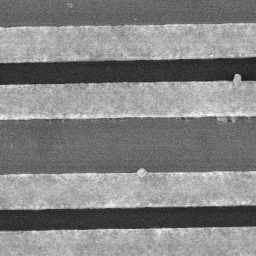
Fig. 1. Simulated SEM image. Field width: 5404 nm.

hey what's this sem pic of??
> lines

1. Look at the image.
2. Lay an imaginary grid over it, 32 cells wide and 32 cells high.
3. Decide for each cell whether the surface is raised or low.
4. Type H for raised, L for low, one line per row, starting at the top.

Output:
LLLLLLLLLLLLLLLLLLLLLLLLLLLLLLLL
LLLLLLLLLLLLLLLLLLLLLLLLLLLLLLLL
LLLLLLLLLLLLLLLLLLLLLLLLLLLLLLLL
LLHHHHHHHHHHHHHHHHHHHHHHHHHHHHHH
HHHHHHHHHHHHHHHHHHHHHHHHHHHHHHHH
HHHHHHHHHHHHHHHHHHHHHHHHHHHHHHHH
HHHHHHHHHHHHHHHHHHHHHHHHHHHHHHHH
HHHHHHHHHHHHHHHHHLLLLLLLLLLLLLLL
LLLLLLLLLLLLLLLLLLLLLLLLLLLLLLLL
LLLLLLLLLLLLLLLLLLLLLLLLLLLLLHLL
LLLLLLLLHHHHHHHHHHHHHHHHHHHHHHHH
HHHHHHHHHHHHHHHHHHHHHHHHHHHHHHHH
HHHHHHHHHHHHHHHHHHHHHHHHHHHHHHHH
HHHHHHHHHHHHHHHHHHHHHHHHHHHHHHHH
HHHHHHHHHHHHHHHHHHHHHHHHHLLLLLLL
LLLLLLLLLLLLLLLLLLLLLLLLLLLLLLLL
LLLLLLLLLLLLLLLLLLLLLLLLLLLLLLLL
LLLLLLLLLLLLLLLLLLLLLLLLLLLLLLLL
LLLLLLLLLLLLLLLLLLLLLLLLLLLLLLLL
LLLLLLLLLLLLLLLLLLLLLLLLLLLLLLLL
LLLLLLLLLLLLLLLLLLLLLLLLLLLLLLLL
LLLLLLLLLLLLLLLLLHHLLLLLLLLLLLLL
HHHHHHHHHHHHHHHHHHHHHHHHHHHHHHHH
HHHHHHHHHHHHHHHHHHHHHHHHHHHHHHHH
HHHHHHHHHHHHHHHHHHHHHHHHHHHHHHHH
HHHHHHHHHHHHHHHHHHHHHHHHHHHHHHHH
LLLLLLLLLLLLLLLLLLLLLLLLLLLLLLLL
LLLLLLLLLLLLLLLLLLLLLLLLLLLLLLLL
LLLLLLLLLLLLLLLLLLLLLLLLHHHHHHHH
HHHHHHHHHHHHHHHHHHHHHHHHHHHHHHHH
HHHHHHHHHHHHHHHHHHHHHHHHHHHHHHHH
HHHHHHHHHHHHHHHHHHHHHHHHHHHHHHHH